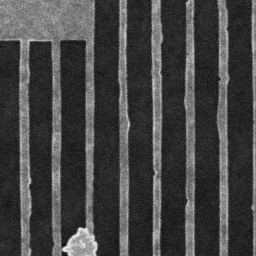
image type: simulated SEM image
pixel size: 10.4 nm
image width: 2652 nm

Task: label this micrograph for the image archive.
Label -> parallel lines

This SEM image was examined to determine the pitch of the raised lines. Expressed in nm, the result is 343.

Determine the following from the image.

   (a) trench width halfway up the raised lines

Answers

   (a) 0.272 µm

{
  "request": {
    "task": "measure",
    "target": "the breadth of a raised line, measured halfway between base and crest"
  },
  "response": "0.079 um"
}